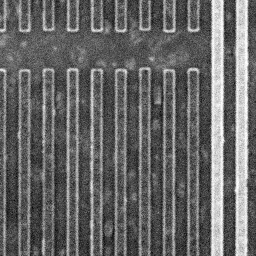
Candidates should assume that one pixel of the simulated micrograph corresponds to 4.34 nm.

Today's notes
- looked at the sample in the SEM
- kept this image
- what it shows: parallel lines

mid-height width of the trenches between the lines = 0.0614 micrometres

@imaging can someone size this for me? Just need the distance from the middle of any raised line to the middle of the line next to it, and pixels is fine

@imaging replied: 24.1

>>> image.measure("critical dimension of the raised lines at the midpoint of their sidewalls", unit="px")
10.4